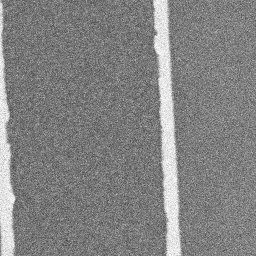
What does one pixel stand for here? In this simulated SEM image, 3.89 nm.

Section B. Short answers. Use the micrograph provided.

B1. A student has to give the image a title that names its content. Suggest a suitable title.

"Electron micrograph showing one or a few lines or trenches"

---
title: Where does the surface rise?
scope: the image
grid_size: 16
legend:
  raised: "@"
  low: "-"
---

@@@@@@@@@@------
@@@@@@@@@@------
@@@@@@@@@@------
@@@@@@@@@@------
@@@@@@@@@@------
@@@@@@@@@@------
@@@@@@@@@@@-----
@@@@@@@@@@@-----
@@@@@@@@@@@-----
@@@@@@@@@@@-----
@@@@@@@@@@@-----
@@@@@@@@@@@-----
@@@@@@@@@@@-----
@@@@@@@@@@@-----
@@@@@@@@@@@-----
@@@@@@@@@@@-----